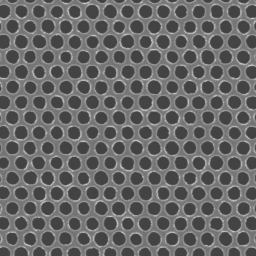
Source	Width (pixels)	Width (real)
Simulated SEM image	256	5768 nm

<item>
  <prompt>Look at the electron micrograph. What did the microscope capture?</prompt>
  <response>a regular array of holes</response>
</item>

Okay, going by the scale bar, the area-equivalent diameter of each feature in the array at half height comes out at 288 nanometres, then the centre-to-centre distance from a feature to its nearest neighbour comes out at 389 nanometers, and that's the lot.